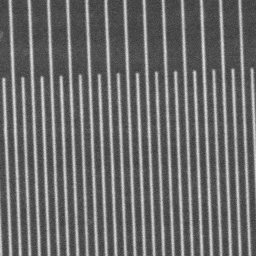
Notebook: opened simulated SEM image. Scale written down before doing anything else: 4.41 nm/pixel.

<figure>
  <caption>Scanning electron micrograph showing parallel lines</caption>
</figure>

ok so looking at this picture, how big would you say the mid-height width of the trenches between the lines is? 35.3 nanometers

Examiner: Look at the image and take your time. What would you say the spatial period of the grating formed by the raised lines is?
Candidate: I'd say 42.2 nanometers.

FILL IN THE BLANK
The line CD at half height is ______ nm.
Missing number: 6.6